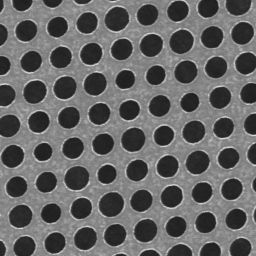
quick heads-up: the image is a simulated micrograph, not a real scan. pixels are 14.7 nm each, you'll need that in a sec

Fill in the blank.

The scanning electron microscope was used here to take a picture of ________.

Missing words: a regular array of holes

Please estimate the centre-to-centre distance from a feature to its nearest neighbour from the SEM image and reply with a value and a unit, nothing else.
30.2 pixels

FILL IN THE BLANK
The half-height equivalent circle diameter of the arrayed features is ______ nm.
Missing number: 324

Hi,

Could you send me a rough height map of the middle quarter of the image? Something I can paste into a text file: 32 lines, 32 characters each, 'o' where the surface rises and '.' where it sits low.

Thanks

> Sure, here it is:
.ooooooooooooooooooooo..oooo....
ooooooooooooooo.ooooo....ooo....
ooooooo..oooo....ooo.....oo.....
..ooo.....ooo.....oo.....ooo....
...oo......oo.....ooo....oooo...
...oo......oo....ooooooooooooooo
...oo.....oooooooooooooooooooooo
...ooo...ooooooooooooooooooooo..
.ooooooooooooooooooooo....ooo...
ooooooooooooooo...ooo......oo...
ooooooo....ooo.....oo......oo...
...ooo......oo.....oo.....oooo..
....oo......oo.....ooo....oooooo
....oo.....oooo...oooooooooooooo
....ooo....oooooooooooooooooooo.
...ooooooooooooooooooooo..oooo..
oooooooooooooooo....ooo....ooo..
ooooooooo..oooo.....oo......o...
o...oooo....oo.......o.....ooo..
.....oo......o......ooo....oooo.
.....oo.....ooo.....oooo.ooooooo
.....oo.....ooo....ooooooooooooo
....oooo...oooooooooooooooooooo.
o..ooooooooooooooooooooo....ooo.
ooooooooooooooooo...ooo.....oo..
ooo.oooooo..oooo.....oo......o..
o.....ooo....ooo.....oo.....ooo.
......oo.....ooo.....ooo....oooo
......oo.....ooo....oooooooooooo
......ooo...oooooooooooooooooooo
o....ooooooooooooooooooooo..oooo
oo..ooooooooooooooo..oooo....ooo